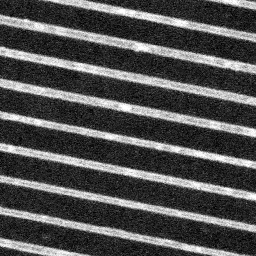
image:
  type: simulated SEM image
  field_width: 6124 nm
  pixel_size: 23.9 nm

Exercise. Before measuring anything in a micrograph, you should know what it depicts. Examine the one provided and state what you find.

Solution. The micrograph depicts parallel lines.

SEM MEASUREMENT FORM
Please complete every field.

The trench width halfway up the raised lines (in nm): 601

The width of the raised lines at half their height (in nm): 141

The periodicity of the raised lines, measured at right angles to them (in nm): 746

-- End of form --